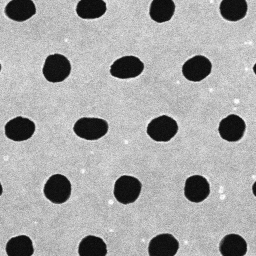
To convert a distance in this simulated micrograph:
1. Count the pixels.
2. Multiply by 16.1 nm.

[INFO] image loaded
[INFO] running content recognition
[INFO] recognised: a regular array of holes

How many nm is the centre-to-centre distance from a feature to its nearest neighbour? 1110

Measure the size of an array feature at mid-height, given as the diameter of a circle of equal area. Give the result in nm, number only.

449